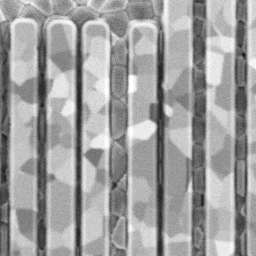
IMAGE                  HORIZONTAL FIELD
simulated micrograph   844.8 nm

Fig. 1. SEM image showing parallel lines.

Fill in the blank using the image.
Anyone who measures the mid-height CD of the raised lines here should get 25.8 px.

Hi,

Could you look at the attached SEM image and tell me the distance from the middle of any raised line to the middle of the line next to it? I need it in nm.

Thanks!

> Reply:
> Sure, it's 131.